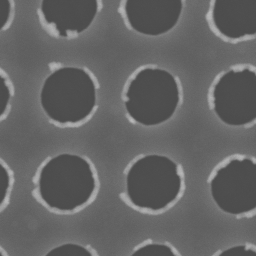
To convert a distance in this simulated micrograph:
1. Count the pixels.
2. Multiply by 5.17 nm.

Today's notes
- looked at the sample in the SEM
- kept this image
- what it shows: holes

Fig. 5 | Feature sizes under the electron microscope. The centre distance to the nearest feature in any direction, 0.437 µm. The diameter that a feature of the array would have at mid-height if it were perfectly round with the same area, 282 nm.